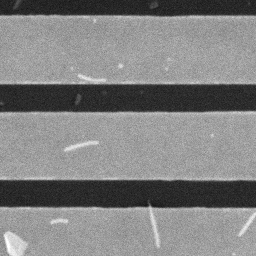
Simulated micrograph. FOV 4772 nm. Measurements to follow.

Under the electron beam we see lines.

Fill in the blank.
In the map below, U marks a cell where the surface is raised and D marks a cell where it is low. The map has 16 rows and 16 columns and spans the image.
DDDDDDDDDDDDDDDD
UUUUUUUUUUUUUUUU
UUUUUUUUUUUUUUUU
UUUUUUUUUUUUUUUU
UUUUUUUUUUUUUUUU
DDDDDDDDDDDDDDDD
DDDDDDDDDDDDDDDD
UUUUUUUUUUUUUUUU
UUUUUUUUUUUUUUUU
UUUUUUUUUUUUUUUU
UUUUUUUUUUUUUUUU
DDDDDDDDDDDDDDDD
DDDDDDDDDDDDDDDD
UUUUUUUUUUUUUUUU
UUUUUUUUUUUUUUUU
UUUUUUUUUUUUUUUU